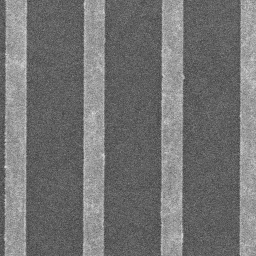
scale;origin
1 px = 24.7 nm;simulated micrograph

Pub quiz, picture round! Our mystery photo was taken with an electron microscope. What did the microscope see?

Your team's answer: one or a few lines or trenches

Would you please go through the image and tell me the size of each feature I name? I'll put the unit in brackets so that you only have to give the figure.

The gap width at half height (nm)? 1430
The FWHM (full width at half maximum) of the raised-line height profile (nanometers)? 491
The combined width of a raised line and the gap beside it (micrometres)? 1.93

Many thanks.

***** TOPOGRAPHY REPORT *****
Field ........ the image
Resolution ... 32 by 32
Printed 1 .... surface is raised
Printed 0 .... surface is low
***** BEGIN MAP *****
01100000000110000000111000000011
01100000000110000000111000000011
01100000000110000000111000000011
01100000000110000000111000000011
01100000000110000000111000000011
01100000000110000000111000000011
01100000000110000000111000000011
01100000000110000000111000000011
01100000000110000000111000000011
01100000000110000000111000000011
01100000000110000000111000000011
01100000000110000000111000000011
01100000000110000000111000000011
01100000000110000000111000000011
01100000000110000000111000000011
01100000000110000000111000000011
01100000000110000000111000000011
01100000000110000000111000000011
01100000000110000000111000000011
01100000000110000000111000000011
01100000000110000000111000000011
01100000000110000000111000000011
01100000000110000000111000000011
01100000000110000000111000000011
01100000000110000000111000000011
01100000000110000000111000000011
01100000000110000000111000000011
01100000000110000000111000000011
01100000000110000000111000000011
01100000000110000000111000000011
01100000000110000000111000000011
01100000000110000000111000000011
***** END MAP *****